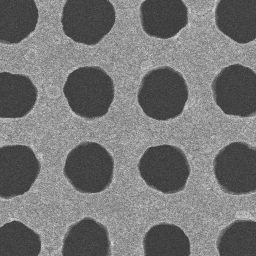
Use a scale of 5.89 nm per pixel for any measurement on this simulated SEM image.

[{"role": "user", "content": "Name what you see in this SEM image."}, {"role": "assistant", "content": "holes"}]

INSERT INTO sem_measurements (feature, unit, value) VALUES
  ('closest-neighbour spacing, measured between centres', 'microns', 0.437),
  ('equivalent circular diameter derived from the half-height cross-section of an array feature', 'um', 0.296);